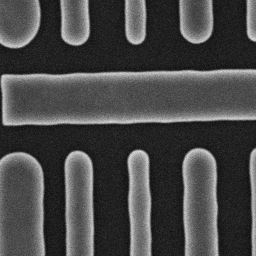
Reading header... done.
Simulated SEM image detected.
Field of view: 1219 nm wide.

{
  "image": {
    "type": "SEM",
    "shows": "groups of lines, slits or small figures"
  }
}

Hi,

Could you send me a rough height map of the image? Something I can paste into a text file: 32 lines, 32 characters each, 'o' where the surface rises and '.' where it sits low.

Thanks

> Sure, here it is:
ooooo...ooo.....oo.....ooo.....o
ooooo...ooo.....oo.....ooo.....o
ooooo...ooo.....oo.....oooo....o
ooooo...ooo.....oo.....ooo.....o
oooo....ooo.....oo.....ooo.....o
ooo......o......................
................................
................................
................................
.ooooooooooooooooooooooooooooooo
oooooooooooooooooooooooooooooooo
oooooooooooooooooooooooooooooooo
oooooooooooooooooooooooooooooooo
oooooooooooooooooooooooooooooooo
oooooooooooooooooooooooooooooooo
.oo.ooo.........................
................................
................................
................................
.ooo.....oo.....oo.....ooo.....o
ooooo...ooo.....oo.....oooo....o
ooooo...ooo.....oo.....oooo....o
ooooo...ooo.....oo.....oooo....o
ooooo...ooo.....ooo....oooo....o
ooooo...ooo.....ooo....oooo.....
ooooo...oooo....ooo....oooo.....
ooooo...oooo....ooo....oooo.....
ooooo...oooo....ooo....oooo.....
ooooo...oooo....ooo....oooo.....
ooooo...oooo....ooo....oooo.....
ooooo...oooo....ooo....oooo.....
oooooo..oooo....ooo....oooo.....